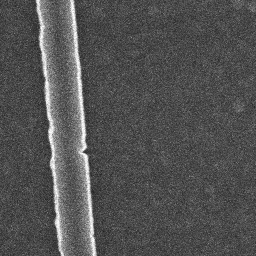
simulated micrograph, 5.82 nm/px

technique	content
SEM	one or a few lines or trenches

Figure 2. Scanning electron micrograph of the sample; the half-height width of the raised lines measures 195 nanometers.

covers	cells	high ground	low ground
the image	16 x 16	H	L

LLHHHLLLLLLLLLLL
LLLHHLLLLLLLLLLL
LLLHHLLLLLLLLLLL
LLLHHLLLLLLLLLLL
LLLHHLLLLLLLLLLL
LLLHHLLLLLLLLLLL
LLLHHLLLLLLLLLLL
LLLHHLLLLLLLLLLL
LLLHHLLLLLLLLLLL
LLLHHLLLLLLLLLLL
LLLHHLLLLLLLLLLL
LLLHHHLLLLLLLLLL
LLLLHHLLLLLLLLLL
LLLLHHLLLLLLLLLL
LLLLHHLLLLLLLLLL
LLLLHHLLLLLLLLLL